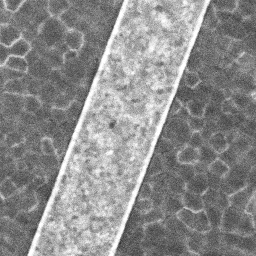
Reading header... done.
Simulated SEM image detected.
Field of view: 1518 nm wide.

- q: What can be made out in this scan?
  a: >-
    one or a few lines or trenches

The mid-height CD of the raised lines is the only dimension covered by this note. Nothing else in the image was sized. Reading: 454 nanometres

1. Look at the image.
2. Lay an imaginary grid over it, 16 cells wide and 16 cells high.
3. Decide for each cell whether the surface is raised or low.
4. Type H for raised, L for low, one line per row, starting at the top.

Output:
LLLLLLLLHHHHHLLL
LLLLLLLHHHHHLLLL
LLLLLLLHHHHHLLLL
LLLLLLLHHHHHLLLL
LLLLLLHHHHHLLLLL
LLLLLLHHHHHLLLLL
LLLLLHHHHHHLLLLL
LLLLLHHHHHLLLLLL
LLLLLHHHHHLLLLLL
LLLLHHHHHLLLLLLL
LLLLHHHHHLLLLLLL
LLLLHHHHHLLLLLLL
LLLHHHHHLLLLLLLL
LLLHHHHHLLLLLLLL
LLHHHHHHLLLLLLLL
LLHHHHHLLLLLLLLL